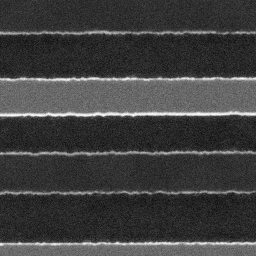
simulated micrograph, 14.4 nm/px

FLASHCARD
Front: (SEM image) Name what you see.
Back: lines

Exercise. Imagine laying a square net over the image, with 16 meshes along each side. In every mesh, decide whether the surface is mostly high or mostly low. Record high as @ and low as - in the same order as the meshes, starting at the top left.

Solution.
@@@@@@@@@@@@@@@@
@@@@@@@@@@@@@@@@
----------------
----------------
----------------
@@@@@@@@@@@@@@@@
@@@@@@@@@@@@@@@@
----------------
----------------
--------@---@@@@
@@@@@@@@@@@@@@@@
@@@@@@@@@@@@@@@@
----------------
----------------
----------------
@@@@@@@@@@@@@@@@